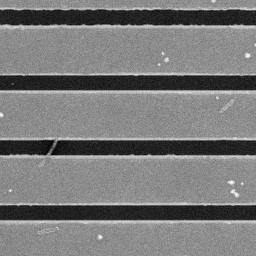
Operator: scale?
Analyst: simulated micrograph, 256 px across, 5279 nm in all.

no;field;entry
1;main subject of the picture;lines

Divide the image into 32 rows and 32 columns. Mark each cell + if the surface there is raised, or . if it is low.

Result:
++++++++++++++++++++++++++++++++
................................
................................
++++++++++++++++++++++++++++++++
++++++++++++++++++++++++++++++++
++++++++++++++++++++++++++++++++
++++++++++++++++++++++++++++++++
++++++++++++++++++++++++++++++++
++++++++++++++++++++++++++++++++
................................
................................
++++++++++++++++++++++++++++++++
++++++++++++++++++++++++++++++++
++++++++++++++++++++++++++++++++
++++++++++++++++++++++++++++++++
++++++++++++++++++++++++++++++++
++++++++++++++++++++++++++++++++
......++........................
................................
++++++++++++++++++++++++++++++++
++++++++++++++++++++++++++++++++
++++++++++++++++++++++++++++++++
++++++++++++++++++++++++++++++++
++++++++++++++++++++++++++++++++
++++++++++++++++++++++++++++++++
++++++++++++++++++++++++++++++++
................................
................................
++++++++++++++++++++++++++++++++
++++++++++++++++++++++++++++++++
++++++++++++++++++++++++++++++++
++++++++++++++++++++++++++++++++